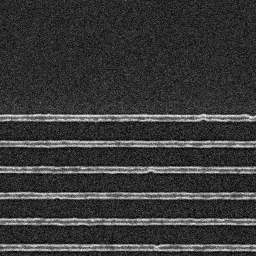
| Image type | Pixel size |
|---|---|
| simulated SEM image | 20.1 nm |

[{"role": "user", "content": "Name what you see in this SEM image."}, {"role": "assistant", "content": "parallel lines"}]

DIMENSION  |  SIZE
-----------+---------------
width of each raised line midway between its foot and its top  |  0.113 µm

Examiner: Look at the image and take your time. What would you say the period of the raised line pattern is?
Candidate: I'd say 520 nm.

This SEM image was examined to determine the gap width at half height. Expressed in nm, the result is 396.